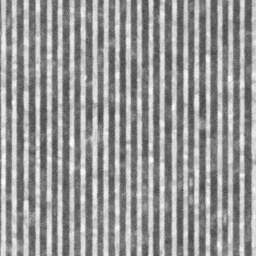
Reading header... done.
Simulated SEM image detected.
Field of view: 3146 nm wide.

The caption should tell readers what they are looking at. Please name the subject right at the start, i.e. parallel lines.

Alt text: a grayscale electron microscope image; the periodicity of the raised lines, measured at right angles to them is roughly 0.14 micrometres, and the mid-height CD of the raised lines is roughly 33.8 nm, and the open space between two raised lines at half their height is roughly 8.25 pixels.